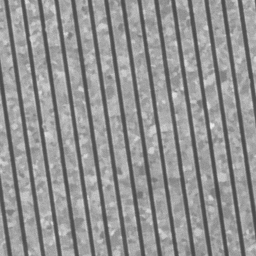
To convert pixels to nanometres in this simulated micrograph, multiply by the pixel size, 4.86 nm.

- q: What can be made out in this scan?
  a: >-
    parallel lines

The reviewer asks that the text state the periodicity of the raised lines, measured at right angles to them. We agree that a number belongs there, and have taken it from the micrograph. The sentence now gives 80.3 nm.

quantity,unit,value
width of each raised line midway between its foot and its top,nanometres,54.7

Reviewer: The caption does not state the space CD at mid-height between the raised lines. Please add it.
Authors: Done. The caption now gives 25.2 nanometers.